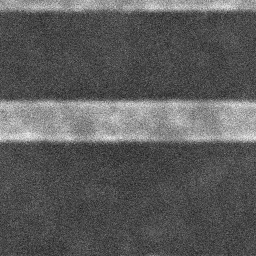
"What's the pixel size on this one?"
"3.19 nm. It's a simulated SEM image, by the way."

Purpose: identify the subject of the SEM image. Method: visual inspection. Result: one or a few lines or trenches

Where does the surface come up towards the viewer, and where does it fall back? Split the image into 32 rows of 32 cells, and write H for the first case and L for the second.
HHHHHHHHHHHHHHHHHHHHHHHHHHHHHHHH
LLLLLLLLLLLLLLLLLLLLLLLLLLLLLLLL
LLLLLLLLLLLLLLLLLLLLLLLLLLLLLLLL
LLLLLLLLLLLLLLLLLLLLLLLLLLLLLLLL
LLLLLLLLLLLLLLLLLLLLLLLLLLLLLLLL
LLLLLLLLLLLLLLLLLLLLLLLLLLLLLLLL
LLLLLLLLLLLLLLLLLLLLLLLLLLLLLLLL
LLLLLLLLLLLLLLLLLLLLLLLLLLLLLLLL
LLLLLLLLLLLLLLLLLLLLLLLLLLLLLLLL
LLLLLLLLLLLLLLLLLLLLLLLLLLLLLLLL
LLLLLLLLLLLLLLLLLLLLLLLLLLLLLLLL
LLLLLLLLLLLLLLLLLLLLLLLLLLLLLLLL
LLLLLLLLLLLLLLLLLLLLLLLLLLLLLLLL
HHHHHHHHHHHHHHHHHHHHHHHHHHHHHHHH
HHHHHHHHHHHHHHHHHHHHHHHHHHHHHHHH
HHHHHHHHHHHHHHHHHHHHHHHHHHHHHHHH
HHHHHHHHHHHHHHHHHHHHHHHHHHHHHHHH
LLLLLLLLLLLHHLLLLLLLLLLLHHLLLLLL
LLLLLLLLLLLLLLLLLLLLLLLLLLLLLLLL
LLLLLLLLLLLLLLLLLLLLLLLLLLLLLLLL
LLLLLLLLLLLLLLLLLLLLLLLLLLLLLLLL
LLLLLLLLLLLLLLLLLLLLLLLLLLLLLLLL
LLLLLLLLLLLLLLLLLLLLLLLLLLLLLLLL
LLLLLLLLLLLLLLLLLLLLLLLLLLLLLLLL
LLLLLLLLLLLLLLLLLLLLLLLLLLLLLLLL
LLLLLLLLLLLLLLLLLLLLLLLLLLLLLLLL
LLLLLLLLLLLLLLLLLLLLLLLLLLLLLLLL
LLLLLLLLLLLLLLLLLLLLLLLLLLLLLLLL
LLLLLLLLLLLLLLLLLLLLLLLLLLLLLLLL
LLLLLLLLLLLLLLLLLLLLLLLLLLLLLLLL
LLLLLLLLLLLLLLLLLLLLLLLLLLLLLLLL
LLLLLLLLLLLLLLLLLLLLLLLLLLLLLLLL